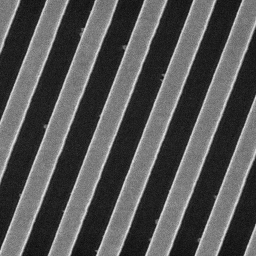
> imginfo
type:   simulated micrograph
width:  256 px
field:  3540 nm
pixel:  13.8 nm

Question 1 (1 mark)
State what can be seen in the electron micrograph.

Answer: lines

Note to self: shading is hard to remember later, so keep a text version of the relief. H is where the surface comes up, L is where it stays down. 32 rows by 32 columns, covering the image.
HHLLLLHHLLLLHHHLLLHHHLLLHHHLLLHH
HHLLLHHHLLLHHHLLLLHHLLLLHHHLLLHH
HHLLLHHHLLLHHHLLLHHHLLLHHHLLLHHH
HLLLHHHLLLLHHHLLLHHHLLLHHHLLLHHH
HLLLHHHLLLHHHLLLHHHLLLLHHLLLLHHL
HLLLHHHLLLHHHLLLHHHLLLHHHLLLHHHL
LLLHHHLLLHHHLLLLHHLLLLHHHLLLHHHL
LLLHHHLLLHHHLLLHHHLLLHHHLLLHHHLL
LLLHHLLLLHHHLLLHHHLLLHHHLLLHHHLL
LLHHHLLLHHHLLLHHHLLLLHHLLLLHHHLL
LLHHHLLLHHHLLLHHHLLLHHHLLLHHHLLL
LHHHLLLLHHLLLLHHHLLLHHHLLLHHHLLL
LHHHLLLHHHLLLHHHLLLHHHLLLLHHLLLL
LHHLLLLHHHLLLHHHLLLHHHLLLHHHLLLH
HHHLLLHHHLLLLHHLLLLHHLLLLHHHLLLH
HHHLLLHHHLLLHHHLLLHHHLLLHHHLLLLH
HHLLLLHHLLLLHHHLLLHHHLLLHHHLLLHH
HHLLLHHHLLLLHHLLLLHHLLLLHHHLLLHH
HHLLLHHHLLLHHHLLLHHHLLLHHHLLLHHH
HLLLHHHLLLLHHHLLLHHHLLLHHHLLLHHH
HLLLHHHLLLHHHLLLHHHLLLLHHLLLLHHH
HLLLHHHLLLHHHLLLHHHLLLHHHLLLHHHL
LLLHHHLLLLHHLLLLHHLLLLHHHLLLHHHL
LLLHHHLLLHHHLLLHHHLLLHHHLLLLHHLL
LLLHHLLLLHHHLLLHHHLLLHHHLLLHHHLL
LLHHHLLLHHHLLLHHHLLLLHHLLLLHHHLL
LLHHHLLLHHHLLLHHHLLLHHHLLLHHHLLL
LHHHLLLLHHLLLLHHHLLLHHHLLLHHHLLL
LHHHLLLHHHLLLHHHLLLHHHLLLLHHHLLL
LHHHLLLHHHLLLHHHLLLHHHLLLHHHLLLH
HHHLLLLHHLLLLHHLLLLHHHLLLHHHLLLH
HHHLLLHHHLLLHHHLLLHHHLLLLHHLLLLH